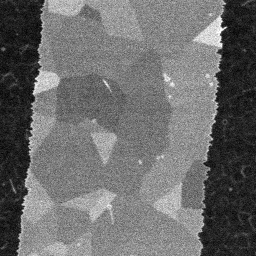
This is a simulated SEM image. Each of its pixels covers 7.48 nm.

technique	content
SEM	one or a few lines or trenches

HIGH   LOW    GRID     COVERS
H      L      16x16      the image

LLLHHHHHHHHHHHLL
LLLHHHHHHHHHHHLL
LLLHHHHHHHHHHHLL
LLHHHHHHHHHHHHLL
LLHHHHHHHHHHHHLL
LLHHHHHHHHHHHHLL
LLHHHHHHHHHHHHLL
LLHHHHHHHHHHHLLL
LLHHHHHHHHHHHLLL
LLHHHHHHHHHHHLLL
LLHHHHHHHHHHHLLL
LLHHHHHHHHHHHLLL
LLHHHHHHHHHHHLLL
LHHHHHHHHHHHHLLL
LHHHHHHHHHHHHLLL
LHHHHHHHHHHHHLLL